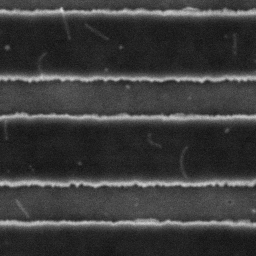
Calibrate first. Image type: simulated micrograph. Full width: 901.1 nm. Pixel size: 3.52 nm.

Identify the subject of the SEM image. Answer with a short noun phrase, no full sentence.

lines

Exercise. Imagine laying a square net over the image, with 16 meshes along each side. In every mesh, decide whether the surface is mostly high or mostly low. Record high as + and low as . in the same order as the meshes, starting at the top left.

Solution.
................
++++++++++++++++
++++++++++++++++
++++++++++++++++
++++++++++++++++
................
................
++++++++++++++++
++++++++++++++++
++++++++++++++++
++++++++++++++++
++++++++++++++++
................
................
++++++++++++++++
++++++++++++++++